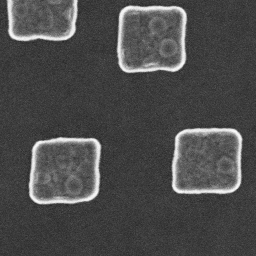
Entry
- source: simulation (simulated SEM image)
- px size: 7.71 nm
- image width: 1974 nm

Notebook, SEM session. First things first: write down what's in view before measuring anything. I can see raised bodies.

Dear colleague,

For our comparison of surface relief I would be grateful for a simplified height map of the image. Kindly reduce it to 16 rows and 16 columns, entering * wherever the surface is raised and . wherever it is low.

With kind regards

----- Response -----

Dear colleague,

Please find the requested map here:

.****...***.....
.****...****....
.......*****....
.......****.....
................
................
................
................
...........****.
..****.....****.
..****.....****.
..****.....****.
..***...........
................
................
................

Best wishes